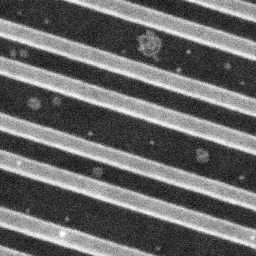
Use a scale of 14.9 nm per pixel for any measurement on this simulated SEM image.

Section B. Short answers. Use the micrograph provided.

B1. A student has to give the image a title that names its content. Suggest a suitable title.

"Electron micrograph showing lines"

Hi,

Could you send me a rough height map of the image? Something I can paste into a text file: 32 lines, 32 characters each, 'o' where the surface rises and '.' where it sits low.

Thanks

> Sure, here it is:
..........ooooooo........oooooo.
.............ooooooo........oooo
................ooooooo........o
oooo...............ooooooo......
ooooooo...............ooooooo...
...ooooooo........oo......oooooo
......ooooooo................ooo
o.........oooooo................
ooooo........oooooo.............
.ooooooo........oooooo..........
....ooooooo........ooooooo......
.......ooooooo........ooooooo...
...........oooooo.........oooooo
..............oooooo.........ooo
o................ooooooo........
oooo................ooooooo.....
.oooooo................ooooooo..
....ooooooo...............oooooo
.......ooooooo...............ooo
oo.........oooooo...............
ooooo.........oooooo............
..oooooo.........oooooo.........
.....ooooooo........oooooo......
........ooooooo........oooooo...
............oooooo.........ooooo
...............oooooo.........oo
oo................oooooo........
ooooo................ooooooo....
.ooooooo................ooooooo.
....ooooooo................ooooo
.......ooooooo................oo
oo.........ooooooo..............